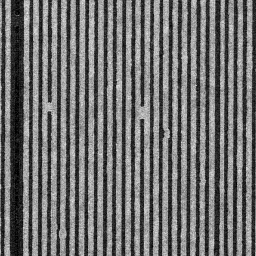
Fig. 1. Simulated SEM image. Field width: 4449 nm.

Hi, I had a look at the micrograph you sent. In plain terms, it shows parallel lines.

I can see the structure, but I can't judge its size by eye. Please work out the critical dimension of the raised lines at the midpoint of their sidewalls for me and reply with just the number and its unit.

86.9 nm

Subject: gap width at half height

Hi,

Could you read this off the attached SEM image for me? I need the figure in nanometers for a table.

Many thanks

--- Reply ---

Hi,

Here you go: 78.2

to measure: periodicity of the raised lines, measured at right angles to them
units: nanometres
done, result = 161